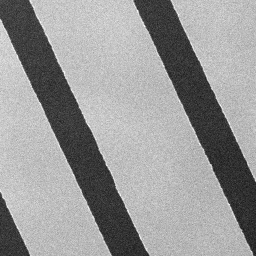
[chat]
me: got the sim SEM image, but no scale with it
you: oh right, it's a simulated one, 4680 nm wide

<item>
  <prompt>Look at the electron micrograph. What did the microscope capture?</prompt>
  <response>one or a few lines or trenches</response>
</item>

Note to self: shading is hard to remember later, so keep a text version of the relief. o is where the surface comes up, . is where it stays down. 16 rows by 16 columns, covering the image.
..ooooooo..ooooo
...oooooo..ooooo
o..oooooo...oooo
o..ooooooo..oooo
oo..oooooo...ooo
oo..ooooooo..ooo
ooo..oooooo...oo
ooo..ooooooo..oo
ooo...oooooo...o
oooo..ooooooo..o
oooo...oooooo...
ooooo..ooooooo..
ooooo...oooooo..
.ooooo..ooooooo.
.ooooo...oooooo.
..ooooo..ooooooo